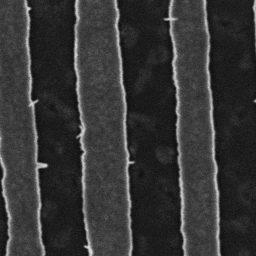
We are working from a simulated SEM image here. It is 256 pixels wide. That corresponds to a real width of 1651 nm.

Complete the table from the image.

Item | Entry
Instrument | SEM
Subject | one or a few lines or trenches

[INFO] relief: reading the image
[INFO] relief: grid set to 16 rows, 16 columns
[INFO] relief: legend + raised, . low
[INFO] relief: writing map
++...++....++...
++...++....++...
++...++....++...
++...+++...++...
++...+++...++...
++...+++...++...
++...+++...++...
++...+++...++...
++...+++...++...
++...+++...++...
++...+++...+++..
++...+++...+++..
++...+++...+++..
.+...+++...+++..
.++..+++...+++..
+++..+++...+++..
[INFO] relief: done